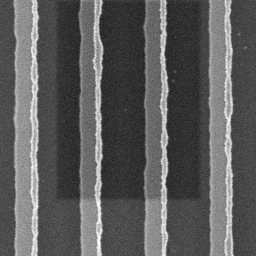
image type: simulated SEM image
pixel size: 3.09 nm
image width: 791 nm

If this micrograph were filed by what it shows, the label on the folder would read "lines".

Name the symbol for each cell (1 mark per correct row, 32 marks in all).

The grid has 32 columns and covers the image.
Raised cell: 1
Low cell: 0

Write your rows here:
00111000001110000011100000111000
00111000001110000011100000111000
00111000001100000011100000111000
00111000001100000011100000111000
00111000001100000011100000111000
00111000001110000011100000111000
00111000001110000011100000111000
00111000001110000011100000111000
00111000001110000011100000111000
00111000001110000011100000111000
00111000001110000011100000111000
00111000001110000011100000111000
00111000001110000011100000111000
00111000001110000011100000111000
00111000001110000011100000111000
00111000001110000011100000111000
00111000001110000011100000111000
00111000001110000011100000111000
00111000001110000011100000111000
00111000001110000011100000111000
00111000001110000011100000111000
00111000001110000011100000111000
00111000001110000011100000111000
00111000001110000011100000111000
00111000001110000011100000111000
00111000001110000011100000111000
00111000001110000011100000111000
00111000001110000011100000111000
00111000001110000011100000111000
00111000001110000011100000111000
00111000001110000011100000111000
00111000001110000011100000111000